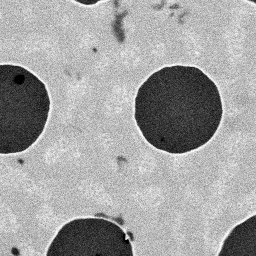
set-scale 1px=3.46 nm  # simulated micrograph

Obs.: holes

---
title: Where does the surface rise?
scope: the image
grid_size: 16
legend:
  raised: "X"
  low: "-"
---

XXXXXXXXXXXXXXXX
XXXXXXXXXXXXXXXX
XXXXXXXXXXXXXXXX
XXXXXXXXXXXXXXXX
--XXXXXXXX---XXX
---XXXXXX-----XX
---XXXXX------XX
---XXXXX------XX
--XXXXXXX----XXX
-XXXXXXXXX--XXXX
XXXXXXXXXXXXXXXX
XXXXXXXXXXXXXXXX
XXXXXXXXXXXXXXXX
XXXXXXXXXXXXXXXX
XXXX----XXXXXX--
XXX-----XXXXXX--